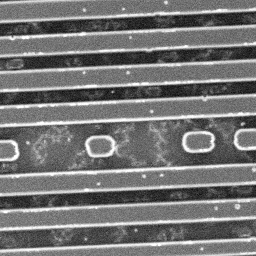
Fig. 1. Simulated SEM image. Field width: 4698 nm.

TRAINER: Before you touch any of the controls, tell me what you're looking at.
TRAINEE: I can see parallel lines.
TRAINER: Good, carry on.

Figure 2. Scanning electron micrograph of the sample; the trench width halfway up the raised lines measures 0.282 µm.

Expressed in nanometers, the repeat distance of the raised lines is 637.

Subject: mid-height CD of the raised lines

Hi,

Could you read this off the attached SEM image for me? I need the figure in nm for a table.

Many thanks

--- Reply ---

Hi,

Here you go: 353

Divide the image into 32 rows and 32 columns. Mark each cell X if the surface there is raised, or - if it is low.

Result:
XXXXXXXXXXXXXXXXXXXXXXXXXXXXXXXX
XXXXXXXXXXXXXXXXXXXXXXXXXXX-----
XXXXX---------------------------
---------------------------XXXXX
-----XXXXXXXXXXXXXXXXXXXXXXXXXXX
XXXXXXXXXXXXXXXXXXXXXXXXXXXXXXXX
XXXXXXXXXXXX--------------------
--------------------------------
------------XXXXXXXXXXXXXXXXXXXX
XXXXXXXXXXXXXXXXXXXXXXXXXXXXXXXX
XXXXXXXXXXXXXXXXXXX-------------
--------------------------------
-------------------XXXXXXXXXXXXX
XXXXXXXXXXXXXXXXXXXXXXXXXXXXXXXX
XXXXXXXXXXXXXXXXXXXXXXXXXX------
XXXX----------------------------
------------------------------XX
-----------XXX---------XXXX--XXX
XX---------XXX---------XXX----XX
XX------------------------------
--------------------------------
-----------XXXXXXXXXXXXXXXXXXXXX
XXXXXXXXXXXXXXXXXXXXXXXXXXXXXXXX
XXXXXXXXXXXXXXXXXX--------------
--------------------------------
------------------XXXXXXXXXXXXXX
XXXXXXXXXXXXXXXXXXXXXXXXXXXXXXXX
XXXXXXXXXXXXXXXXXXXXXXXXX-------
XXXX----------------------------
--------------------------------
-------------------XXXXXXXXXXXXX
XXXXXXXXXXXXXXXXXXXXXXXXXXXXXXXX